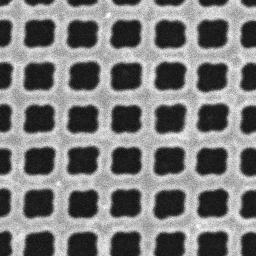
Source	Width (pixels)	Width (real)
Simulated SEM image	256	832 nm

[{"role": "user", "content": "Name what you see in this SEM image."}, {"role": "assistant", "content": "a regular array of holes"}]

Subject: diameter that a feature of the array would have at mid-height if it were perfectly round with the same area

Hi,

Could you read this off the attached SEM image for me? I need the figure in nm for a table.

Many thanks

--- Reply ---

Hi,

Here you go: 102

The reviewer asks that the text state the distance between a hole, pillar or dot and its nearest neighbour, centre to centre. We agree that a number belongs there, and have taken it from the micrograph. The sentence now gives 137 nanometers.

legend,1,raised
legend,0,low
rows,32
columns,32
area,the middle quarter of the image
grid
11000000011100000001111000000011
10000000011100000000111000000001
10000000011100000001111000000011
11000000011100000001111000000011
10000000011100000001110000000011
10000000111100000001111000000011
11101101111110011111111101100111
11111111111111111111111111111111
11111111111111111111111111111111
11111111111111111111111111111111
11001000111110000001111100000011
10000000011100000001111000000001
10000000011100000001111000000011
10000000111100000001111000000011
10000000011100000001111000000011
10000000011100000001111000000011
10000000111100000001111000000011
11111111111111111111111101111111
11111111111111111111111111111111
11111111111111111111111111111111
11111111111111111111111111111111
10000000011100000001111000000011
10000000011100000001110000000011
10000000111100000001111000000011
10000000111100000001111000000011
10000000011100000001110000000011
10000000111100000001110000000011
10000001111100000011111000101111
11111111111111111111111111111111
11111111111111111111111111111111
11111111111111111111111111111111
11111101111110000001111111100111